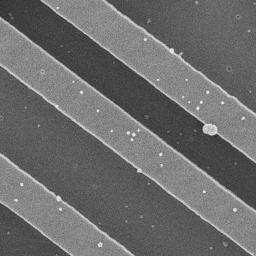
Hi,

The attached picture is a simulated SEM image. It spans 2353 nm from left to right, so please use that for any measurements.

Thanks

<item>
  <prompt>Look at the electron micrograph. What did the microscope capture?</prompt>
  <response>lines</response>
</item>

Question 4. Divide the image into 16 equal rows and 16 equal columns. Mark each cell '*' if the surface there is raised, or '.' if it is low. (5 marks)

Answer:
...****.........
*...*****.......
**....****......
***....****.....
.****...****....
..****....****..
...****....****.
....****....****
......****....**
.......****....*
*.......****....
***.......****..
****.......****.
.****.......****
...***........**
....****.......*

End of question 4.